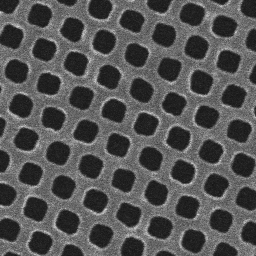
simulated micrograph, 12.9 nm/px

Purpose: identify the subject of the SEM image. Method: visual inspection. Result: a regular array of holes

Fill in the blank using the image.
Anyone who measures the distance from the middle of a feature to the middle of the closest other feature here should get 442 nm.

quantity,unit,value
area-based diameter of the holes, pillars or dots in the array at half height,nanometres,311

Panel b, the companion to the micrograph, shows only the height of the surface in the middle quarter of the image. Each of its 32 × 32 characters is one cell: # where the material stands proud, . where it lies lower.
......####..#####...####......##
.....####.....#########......###
##...####.....#########......###
########......##########....####
########......###....###########
###.######...####.....##########
##.....#########......##########
##......########......####...###
#......##########.....###.....##
#......###.....####..###.......#
##....####.....#########......##
####.#####......#########.....##
#########......####...####...###
##########.....###.....#########
####...#####..####......########
###......########......#########
###......########......###.....#
##......####..####....####......
###.....###.....##########......
#####..####......########......#
.##########......#########.....#
..#########.....###.....####..##
..#########.....###......#######
.###.....##########......#######
.###......#########.....####...#
####......#########.....###.....
####.....####....####...###.....
####.....###......#########.....
..####..####......#########.....
...#########......###..######...
...#########.....####.....######
...###...#####...###......######